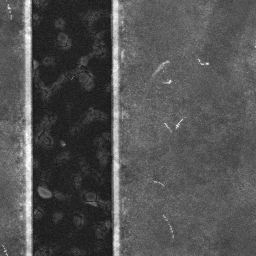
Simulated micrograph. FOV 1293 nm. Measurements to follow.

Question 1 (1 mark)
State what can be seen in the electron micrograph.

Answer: one or a few lines or trenches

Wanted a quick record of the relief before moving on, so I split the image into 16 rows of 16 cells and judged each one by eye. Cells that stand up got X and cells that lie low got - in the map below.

XX-----XXXXXXXXX
XX-----XXXXXXXXX
XX-----XXXXXXXXX
XX-----XXXXXXXXX
XX-----XXXXXXXXX
XX-----XXXXXXXXX
XX-----XXXXXXXXX
XX-----XXXXXXXXX
XX-----XXXXXXXXX
XX-----XXXXXXXXX
XX-----XXXXXXXXX
XX-----XXXXXXXXX
XX-----XXXXXXXXX
XX-----XXXXXXXXX
XX-----XXXXXXXXX
XX-----XXXXXXXXX